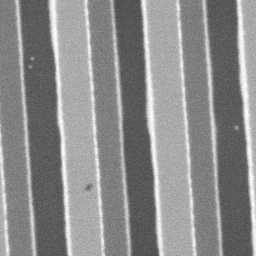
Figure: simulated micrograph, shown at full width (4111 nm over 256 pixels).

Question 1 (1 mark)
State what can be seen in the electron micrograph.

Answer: lines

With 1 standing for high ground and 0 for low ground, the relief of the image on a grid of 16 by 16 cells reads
1001111001111001
1001111001111001
1001111001111001
1001111001111001
1000111001111001
1000111001111001
1000111001111001
1100111001111001
1100111101111001
1100111100111000
1100111100111000
1100111100111100
1100111100111100
1100111100111100
1100111100111100
1100111100111100